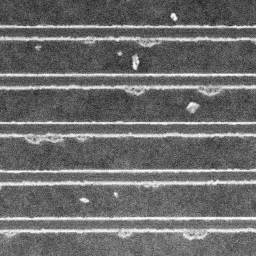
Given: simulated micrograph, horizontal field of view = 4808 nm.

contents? lines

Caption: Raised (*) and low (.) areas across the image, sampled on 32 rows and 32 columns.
................................
................................
................................
********************************
********************************
..................*.............
................................
................................
................................
********************************
********************************
..........................*.....
................................
................................
................................
********************************
********************************
....*...........................
................................
................................
................................
********************************
********************************
................................
................................
................................
................................
********************************
********************************
........................*.......
................................
................................